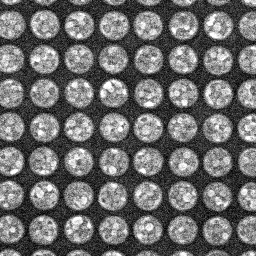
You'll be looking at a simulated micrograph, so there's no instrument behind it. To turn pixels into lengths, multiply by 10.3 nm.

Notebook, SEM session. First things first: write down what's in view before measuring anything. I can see a regular array of raised bodies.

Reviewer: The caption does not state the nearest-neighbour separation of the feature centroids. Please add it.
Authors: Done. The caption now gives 33.9 pixels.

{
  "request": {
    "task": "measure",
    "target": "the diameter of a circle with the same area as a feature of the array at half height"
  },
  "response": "284 nm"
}